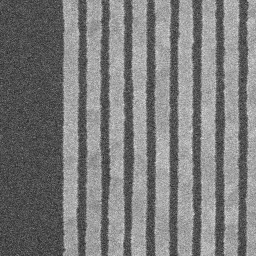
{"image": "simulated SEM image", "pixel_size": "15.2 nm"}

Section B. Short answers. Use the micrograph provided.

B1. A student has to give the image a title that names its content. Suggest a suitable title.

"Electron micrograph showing parallel lines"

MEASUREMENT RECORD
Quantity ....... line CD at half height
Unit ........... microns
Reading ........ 0.198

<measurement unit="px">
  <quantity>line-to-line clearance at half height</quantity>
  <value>9.75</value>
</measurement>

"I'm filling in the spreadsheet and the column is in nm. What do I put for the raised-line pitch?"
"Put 349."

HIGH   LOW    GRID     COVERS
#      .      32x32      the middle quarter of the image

###...###...###..###...###...###
###...###..####..####..###...###
####..###..####..####..###...###
###...###...###..####..###...###
###...###...###..###...###...###
###...###...###..###...###...###
####..###...###...##...###...###
###...###..####..###...###...###
###...###...###..###...###...###
###...###...###..###...###...###
###...###...###...##...###...###
###...###...###..###...###...###
###...###...###...##...###...###
###...###...###...##...###...###
###...###..####..###...###...###
###...###..####...##...###...###
###...###..####...###..###...###
###...###...###...##...###...###
###...###..####...##...###...###
###...###...###...##...###...###
###...###...###...###..###...###
###...###...###...##...###...###
###...###...###...##...###...###
###...###...###...###..###...###
###...###...###...###..###...###
###...###...###...##...###...###
###...###...###...##...###...###
###...###...###...##...###...###
###...###...###..####..###...###
###...###...###..###...###...###
###...###...###..###...###...###
###...###..####..####..###...###